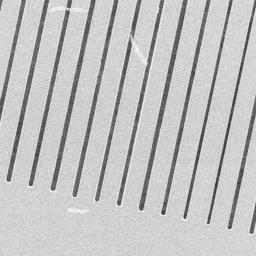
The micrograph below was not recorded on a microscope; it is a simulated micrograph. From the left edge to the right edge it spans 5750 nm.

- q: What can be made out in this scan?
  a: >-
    parallel lines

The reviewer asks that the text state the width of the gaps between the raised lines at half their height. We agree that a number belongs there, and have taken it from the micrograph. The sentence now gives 0.113 um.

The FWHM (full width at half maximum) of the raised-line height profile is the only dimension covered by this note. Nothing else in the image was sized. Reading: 404 nanometres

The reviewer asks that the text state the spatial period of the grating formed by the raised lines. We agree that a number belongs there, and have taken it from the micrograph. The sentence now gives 508 nm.